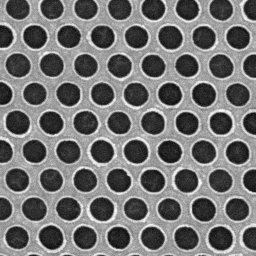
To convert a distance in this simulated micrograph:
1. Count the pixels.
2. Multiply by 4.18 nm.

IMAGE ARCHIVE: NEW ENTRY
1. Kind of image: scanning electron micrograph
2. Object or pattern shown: a regular array of holes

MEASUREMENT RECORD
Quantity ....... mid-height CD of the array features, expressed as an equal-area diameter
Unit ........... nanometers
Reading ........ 104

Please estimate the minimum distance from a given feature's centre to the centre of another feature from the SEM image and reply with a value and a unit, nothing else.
138 nm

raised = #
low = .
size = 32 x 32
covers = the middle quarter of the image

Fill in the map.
##.......#.......##.......#.....
##......###......##......###....
###.....####....####.....####...
#####.#######..#######.#########
.########.#######..#######.#####
...####.....###.....####.....###
....###.....###......##......###
....##.......##......##.......##
....###......##......##.......##
....###.....###......###.....###
...######..######..#######..####
################################
###.....####....####....####....
##......###.....###......###....
##.......#.......##......###....
##.......##......##......###....
###.....###......###.....###....
####...#####....#####...#####...
################################
...####....#####....####....####
....###.....###......##......###
....##.......##......##.......##
....##.......##......##.......##
....###.....###......###.....###
...#####....####....#####...####
################################
###....#####...#####....#####...
###.....###.....###......###....
##......##.......##......##.....
##.......##......##.......##....
##......###......##......###....
###....#####....####.....####...